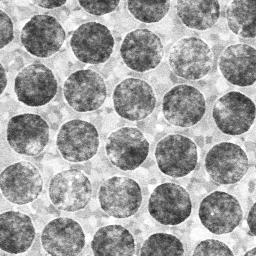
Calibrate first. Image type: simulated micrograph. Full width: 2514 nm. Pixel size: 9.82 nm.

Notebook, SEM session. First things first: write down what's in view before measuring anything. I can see a regular array of holes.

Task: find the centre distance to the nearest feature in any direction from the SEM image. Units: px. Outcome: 49.4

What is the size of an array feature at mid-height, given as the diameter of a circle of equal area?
431 nm